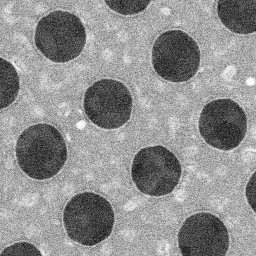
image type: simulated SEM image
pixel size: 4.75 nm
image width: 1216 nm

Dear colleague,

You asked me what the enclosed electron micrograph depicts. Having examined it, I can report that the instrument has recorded raised bodies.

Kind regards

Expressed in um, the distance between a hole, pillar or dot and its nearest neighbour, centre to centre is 0.391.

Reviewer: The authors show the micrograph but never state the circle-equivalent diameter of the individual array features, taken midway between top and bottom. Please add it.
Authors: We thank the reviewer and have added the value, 254 nanometers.